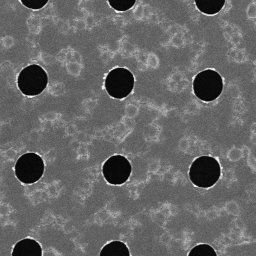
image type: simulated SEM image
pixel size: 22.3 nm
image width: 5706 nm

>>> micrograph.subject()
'holes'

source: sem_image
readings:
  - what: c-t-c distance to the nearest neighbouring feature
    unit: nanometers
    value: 1940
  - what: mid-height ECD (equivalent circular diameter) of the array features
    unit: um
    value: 0.676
